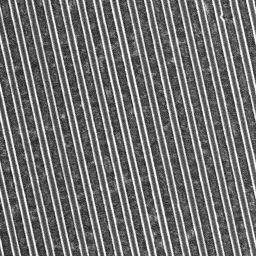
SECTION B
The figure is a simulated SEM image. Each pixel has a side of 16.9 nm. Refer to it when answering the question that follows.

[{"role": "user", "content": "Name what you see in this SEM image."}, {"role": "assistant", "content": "parallel lines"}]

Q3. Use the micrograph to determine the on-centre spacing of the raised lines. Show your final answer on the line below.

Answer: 280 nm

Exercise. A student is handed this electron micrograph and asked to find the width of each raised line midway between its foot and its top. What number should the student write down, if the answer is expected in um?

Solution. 0.113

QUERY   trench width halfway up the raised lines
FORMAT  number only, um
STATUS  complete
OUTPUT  0.173